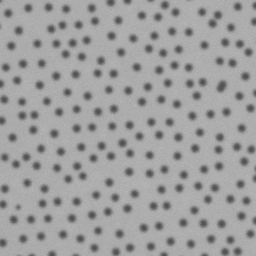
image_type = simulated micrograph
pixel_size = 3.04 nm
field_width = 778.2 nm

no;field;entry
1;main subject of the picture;a regular array of holes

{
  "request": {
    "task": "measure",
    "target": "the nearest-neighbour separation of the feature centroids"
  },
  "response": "48.8 nanometres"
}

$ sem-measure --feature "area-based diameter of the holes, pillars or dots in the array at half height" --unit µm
0.0245